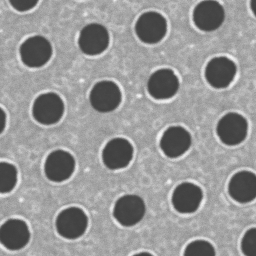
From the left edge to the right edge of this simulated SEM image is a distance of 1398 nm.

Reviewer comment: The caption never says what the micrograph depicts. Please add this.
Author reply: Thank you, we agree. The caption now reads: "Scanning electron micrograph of a regular array of holes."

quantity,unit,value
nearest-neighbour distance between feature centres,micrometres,0.318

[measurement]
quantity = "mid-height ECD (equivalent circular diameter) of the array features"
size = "173 nm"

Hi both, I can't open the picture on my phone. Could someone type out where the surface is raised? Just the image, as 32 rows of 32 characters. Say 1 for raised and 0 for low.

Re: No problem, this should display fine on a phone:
10000111111111111111111110011110
11111111111111111111111100001111
11111111111111111000011100001111
11111111110001111000011110011111
11110111110000111000111111111111
11100011110000111111111111111111
11000011110001111111111111111111
11100011111111111111111111000111
11111111111111111111111111000111
11111111111111111110001111000111
11111111111100111100001111000111
11111111111000011110001111111111
11110000111000011111111111111111
11110000111100111111111111111111
01110000111111111111111111110011
01111001111111111111111111100001
11111111111111111111100111100001
11111111111111001111000011110011
11111111111110000111000011111111
11111100011110000111100111111111
01111100011110001111111111111111
00111100011111111111111111111101
00111100111111111111111111111000
00111111111111111111110001111000
11111111111111110111110001111000
11111111111111000011110001111111
11111111001111000011110011111111
10011110000111100011111111111111
00001110000111111111111111111111
00001111001111111111111111111100
00011111111111111111111100111100
11111111111111111111111000011100